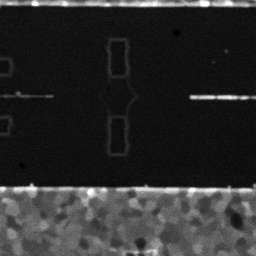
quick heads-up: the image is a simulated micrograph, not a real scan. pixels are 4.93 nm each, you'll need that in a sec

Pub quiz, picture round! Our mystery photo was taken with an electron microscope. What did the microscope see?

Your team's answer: wiring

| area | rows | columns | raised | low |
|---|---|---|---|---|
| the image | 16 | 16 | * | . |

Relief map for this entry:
................
................
................
................
................
................
................
................
................
................
................
................
****************
****************
****************
****************